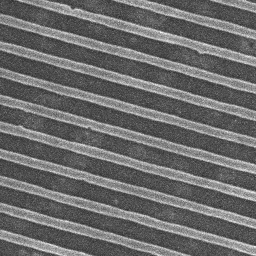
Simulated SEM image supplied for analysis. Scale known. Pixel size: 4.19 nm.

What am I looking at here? parallel lines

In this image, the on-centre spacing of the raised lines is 109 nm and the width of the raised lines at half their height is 34.8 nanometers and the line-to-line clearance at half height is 0.0727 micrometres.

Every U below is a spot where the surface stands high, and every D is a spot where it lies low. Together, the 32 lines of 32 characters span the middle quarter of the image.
UUUUUUUDDDDDDDDDDDDDDDDDUUUUUUUD
DDUUUUUUUUDDDDDDDDDDDDDDDDDUUUUU
DDDDDDUUUUUUUUDDDDDDDDDDDDDDDDDU
DDDDDDDDDDUUUUUUUDDDDDDDDDDDDDDD
DDDDDDDDDDDDUUUUUUUUUDDDDDDDDDDD
DDDDDDDDDDDDDDDDDUUUUUUUDDDDDDDD
UUUUDDDDDDDDDDDDDDDDUUUUUUUUDDDD
UUUUUUUDDDDDDDDDDDDDDDDDUUUUUUUU
DDDDUUUUUUUDDDDDDDDDDDDDDDDDUUUU
DDDDDDDUUUUUUUUDDDDDDDDDDDDDDDDU
DDDDDDDDDDUUUUUUUUDDDDDDDDDDDDDD
DDDDDDDDDDDDDDUUUUUUUUDDDDDDDDDD
UUDDDDDDDDDDDDDDDUUUUUUUUUDDDDDD
UUUUUDDDDDDDDDDDDDDDDUUUUUUUUDDD
UUUUUUUUDDDDDDDDDDDDDDDDDUUUUUUU
DDDDUUUUUUUUDDDDDDDDDDDDDDDDDUUU
DDDDDDDDUUUUUUUUDDDDDDDDDDDDDDDD
DDDDDDDDDDDUUUUUUUUDDDDDDDDDDDDD
DDDDDDDDDDDDDDDUUUUUUUUDDDDDDDDD
UDDDDDDDDDDDDDDDDDDUUUUUUUDDDDDD
UUUUUUDDDDDDDDDDDDDDDDUUUUUUUUDD
DDUUUUUUUUDDDDDDDDDDDDDDDDUUUUUU
DDDDDUUUUUUUUDDDDDDDDDDDDDDDDUUU
DDDDDDDDUUUUUUUUUDDDDDDDDDDDDDDD
DDDDDDDDDDDDDUUUUUUUDDDDDDDDDDDD
DDDDDDDDDDDDDDDDUUUUUUUUDDDDDDDD
UUUDDDDDDDDDDDDDDDDUUUUUUUUUDDDD
UUUUUUDDDDDDDDDDDDDDDDDUUUUUUUUD
DDUUUUUUUUDDDDDDDDDDDDDDDDUUUUUU
DDDDDDUUUUUUUDDDDDDDDDDDDDDDDDDU
DDDDDDDDDUUUUUUUUDDDDDDDDDDDDDDD
DDDDDDDDDDDDDUUUUUUUUUDDDDDDDDDD